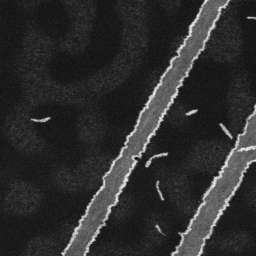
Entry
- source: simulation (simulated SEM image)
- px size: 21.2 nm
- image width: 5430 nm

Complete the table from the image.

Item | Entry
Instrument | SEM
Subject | one or a few lines or trenches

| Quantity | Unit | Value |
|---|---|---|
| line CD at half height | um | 0.415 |